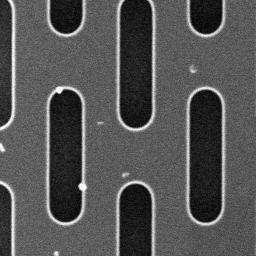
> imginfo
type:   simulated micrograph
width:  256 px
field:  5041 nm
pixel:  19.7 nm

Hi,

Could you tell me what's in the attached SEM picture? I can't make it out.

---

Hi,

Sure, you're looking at groups of lines, slits or small figures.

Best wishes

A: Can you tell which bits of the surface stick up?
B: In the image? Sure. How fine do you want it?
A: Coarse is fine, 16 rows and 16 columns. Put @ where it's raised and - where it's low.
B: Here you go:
-@@--@@@--@@--@@
-@@--@@---@@--@@
-@@@@@@---@@@@@@
-@@@@@@---@@@@@@
-@@@@@@---@@@@@@
-@@@@@@---@@@@@@
-@@--@@---@@--@@
-@@--@@@-@@@--@@
@@@--@@@@@@@--@@
@@@--@@@@@@@--@@
@@@--@@@@@@@--@@
@@@--@@@-@@@--@@
-@@--@@---@@--@@
-@@--@@---@@--@@
-@@@@@@---@@@@@@
-@@@@@@---@@@@@@